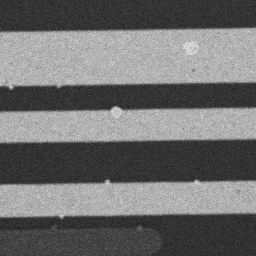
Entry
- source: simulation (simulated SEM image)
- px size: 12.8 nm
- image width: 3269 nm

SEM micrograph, groups of lines, slits or small figures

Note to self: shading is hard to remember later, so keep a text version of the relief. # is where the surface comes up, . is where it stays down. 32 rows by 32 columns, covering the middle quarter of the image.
################################
####.########.##################
################################
################################
#############.##################
................................
................................
................................
................................
................................
................................
............###............#####
################################
################################
#################.##############
##############.#################
########################.####.##
################################
################################
................................
................................
................................
................................
................................
................................
................................
................................
................................
................................
..........#.....................
########################.######.
#######################.########